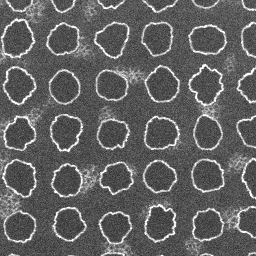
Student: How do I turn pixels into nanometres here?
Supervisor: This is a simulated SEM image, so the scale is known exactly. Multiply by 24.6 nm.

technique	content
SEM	a regular array of raised bodies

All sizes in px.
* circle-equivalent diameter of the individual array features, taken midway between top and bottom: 31.4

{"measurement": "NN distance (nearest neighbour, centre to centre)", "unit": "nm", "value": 1090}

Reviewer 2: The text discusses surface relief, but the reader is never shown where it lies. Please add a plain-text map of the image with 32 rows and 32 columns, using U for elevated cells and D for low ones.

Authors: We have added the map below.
DUUUDDDUUDDDDUUDDDUUUUDDUUUDDDUU
DDDDDDDDDDDDDDDDDDDDDDDDDDDDDDDD
DDDDDDDDDDDDDDDDDDDDDDDDDDDDDDDD
DUUUDDDUUDDDDUUUDDUUUDDDDUUDDDDU
UUUUDDUUUUDDUUUUDDUUUDDDUUUUDDUU
UUUUDDUUUUDDUUUUDDUUUDDDUUUUDDUU
UUUDDDDUUDDDDUUDDDDUUDDDDUUDDDDU
DDDDDDDDDDDDDDDDDDDDDDDDDDDDDDDD
DDDDDDDDDDDDDDDDDDDDUDDDDUDDDDDD
DUUUDDDUUDDDUUUDDDDUUUDDUUUUDDDU
DUUUDDUUUUDDUUUUDDUUUUDDUUUUDDUU
DUUUDDUUUUDDUUUUDDDUUUDDUUUUDDUU
DUUDDDDUUDDDDDDDDDDUUDDDDUUDDDDU
DDDDDDDDDDDDDDDDDDDDDDDDDDDDDDDD
DDDDDDDUUDDDDDDDDDDDDDDDDUDDDDDD
DUUUDDDUUUDDDUUUDDDUUUDDDUUDDDUU
DUUUDDUUUUDDUUUUDDUUUUDDUUUUDDUU
DUUUDDDUUUDDUUUUDDUUUUDDUUUDDDUU
DUUDDDDUUDDDDUDDDDDUUDDDDUUDDDDD
DDDDDDDDDDDDDDDDDDDDDDDDDDDDDDDD
DUUUDDDDDDDDDDUUDDDUUDDDUUUDDDDU
DUUUDDDUUUDDDUUUDDUUUUDDUUUUDDUU
DUUUDDDUUUDDDUUUUDUUUUDDUUUUDDUU
DUUUDDDUUUDDDUUUDDDUUDDDDUUDDDDU
DDDDDDDDUDDDDDDDDDDDDDDDDDDDDDDD
DDDDDDDDDDDDDDDDDDDDDDDDDDDDDDDD
DDUDDDDUUUDDDDDDDDDUUUDDDUUDDDUU
DUUUDDDUUUDDDUUUDDUUUUDDUUUUDDUU
DUUUDDDUUUUDDUUUDDUUUUDDUUUUDDUU
DUUUDDDUUUDDDUUUDDDUUDDDUUUDDDDD
DDDDDDDDDDDDDDDDDDDDDDDDDDDDDDDD
DDDDDDDDDDDDDDDDDDDDDDDDDDDDDDDD